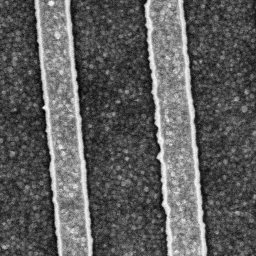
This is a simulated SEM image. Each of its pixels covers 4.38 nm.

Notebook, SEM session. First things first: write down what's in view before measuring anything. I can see one or a few lines or trenches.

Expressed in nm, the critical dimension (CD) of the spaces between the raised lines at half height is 340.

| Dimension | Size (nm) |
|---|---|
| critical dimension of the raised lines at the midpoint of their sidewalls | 146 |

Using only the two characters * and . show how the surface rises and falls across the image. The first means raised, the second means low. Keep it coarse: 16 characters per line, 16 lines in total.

..**.....**.....
..**.....**.....
..**.....***....
...**....***....
...**.....**....
...**.....**....
...**.....**....
...**.....**....
...**.....**....
...**.....**....
...**.....**....
...**.....**....
...**.....***...
...***....***...
....**....***...
....**.....**...